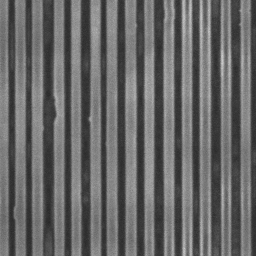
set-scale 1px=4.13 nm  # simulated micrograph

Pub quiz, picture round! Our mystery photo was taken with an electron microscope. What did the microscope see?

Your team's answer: parallel lines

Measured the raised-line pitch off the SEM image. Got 0.0774 um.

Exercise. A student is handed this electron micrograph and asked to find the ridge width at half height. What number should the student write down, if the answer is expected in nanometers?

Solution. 38.7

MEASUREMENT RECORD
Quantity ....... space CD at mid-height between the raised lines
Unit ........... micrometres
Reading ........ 0.0351